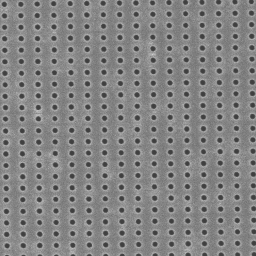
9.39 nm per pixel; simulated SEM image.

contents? a regular array of holes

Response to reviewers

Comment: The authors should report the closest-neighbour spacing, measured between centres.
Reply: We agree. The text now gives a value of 107 nm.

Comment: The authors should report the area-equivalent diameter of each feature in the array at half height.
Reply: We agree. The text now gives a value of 0.0474 micrometres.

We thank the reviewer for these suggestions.